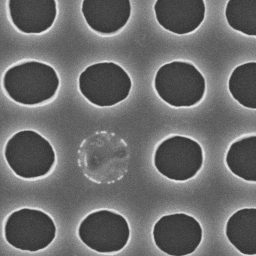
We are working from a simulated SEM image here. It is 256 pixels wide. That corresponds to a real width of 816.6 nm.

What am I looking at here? holes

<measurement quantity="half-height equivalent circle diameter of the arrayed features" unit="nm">151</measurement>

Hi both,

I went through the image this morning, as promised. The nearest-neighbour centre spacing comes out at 74.2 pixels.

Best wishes